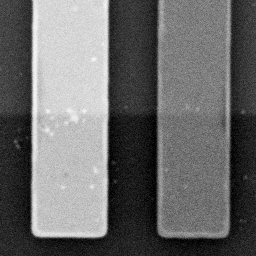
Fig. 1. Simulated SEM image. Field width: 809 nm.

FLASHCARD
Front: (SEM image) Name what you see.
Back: wiring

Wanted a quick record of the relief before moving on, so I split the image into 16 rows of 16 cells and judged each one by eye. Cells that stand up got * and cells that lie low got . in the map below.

..*****...****..
..*****...****..
..*****...****..
..*****...****..
..*****...****..
..*****...****..
..*****...****..
..*****...****..
..*****...****..
..*****...****..
..*****...****..
..*****...****..
..*****...****..
..*****...****..
..****....****..
................